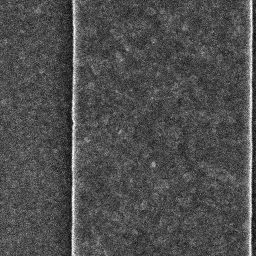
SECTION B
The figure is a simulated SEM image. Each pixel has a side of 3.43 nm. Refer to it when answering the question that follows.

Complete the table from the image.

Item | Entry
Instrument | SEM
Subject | one or a few lines or trenches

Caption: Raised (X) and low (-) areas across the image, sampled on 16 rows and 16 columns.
-----XXXXXXXXXXX
-----XXXXXXXXXXX
-----XXXXXXXXXXX
-----XXXXXXXXXXX
-----XXXXXXXXXXX
-----XXXXXXXXXXX
-----XXXXXXXXXXX
-----XXXXXXXXXXX
-----XXXXXXXXXXX
-----XXXXXXXXXXX
-----XXXXXXXXXXX
-----XXXXXXXXXXX
-----XXXXXXXXXXX
-----XXXXXXXXXXX
-----XXXXXXXXXXX
-----XXXXXXXXXXX